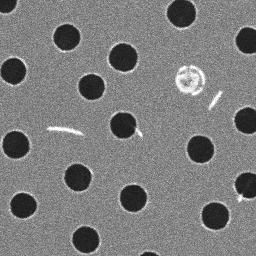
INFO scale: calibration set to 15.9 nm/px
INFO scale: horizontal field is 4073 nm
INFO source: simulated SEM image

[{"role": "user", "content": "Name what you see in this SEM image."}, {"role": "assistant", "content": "a regular array of holes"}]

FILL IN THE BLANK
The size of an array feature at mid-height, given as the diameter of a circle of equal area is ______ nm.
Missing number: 443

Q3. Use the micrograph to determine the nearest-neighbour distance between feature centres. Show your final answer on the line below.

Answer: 941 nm